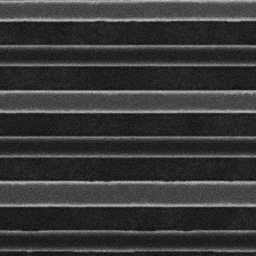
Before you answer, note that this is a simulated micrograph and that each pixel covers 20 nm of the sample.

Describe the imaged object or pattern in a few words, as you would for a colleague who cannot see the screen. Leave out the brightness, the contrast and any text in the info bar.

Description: lines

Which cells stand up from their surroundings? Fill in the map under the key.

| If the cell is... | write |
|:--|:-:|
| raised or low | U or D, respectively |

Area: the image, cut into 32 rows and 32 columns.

UUUUUUUUUUUUUUUUUUUUUUUUUUUUUUUU
UUUUUUUUUUUUUUUUUUUUUUUUUUUUUUUU
UUUUUUUUUUUUUUUUUUUUUUDDDDDDDDDD
DDDDDDDDDDDDDDDDDDDDDDDDDDDDDDDD
DDDDDDDDDDDDDDDDDDDDDDDDDDDDDDDD
DDDDDDDDDDDDDDDDDDDDDDDDDDDDDDDD
UUUUUUUUUUUUUUUUUUUUUUUUUUUUUUUU
UUUUUUUUUUUUUUUUUUUUUUUUUUUUUUUU
DDDDDDDDDDDDDDDDDDDDDDDDDDDDDDDD
DDDDDDDDDDDDDDDDDDDDDDDDDDDDDDDD
DDDDDDDDDDDDDDDDDDDDDDDDDDDDDDDD
UUUUUUUUUUUUUUUUUUUUUUUUUUUUUUUU
UUUUUUUUUUUUUUUUUUUUUUUUUUUUUUUU
UUUUUUUUUUUUUUUUUUUUUUUUUUUUUUUU
DDDDDDDDDDDDDDDDDDDDDDDDDDDDDDDD
DDDDDDDDDDDDDDDDDDDDDDDDDDDDDDDD
DDDDDDDDDDDDDDDDDDDDDDDDDDDDDDDD
UUUUUUUUUUUUUUUUUUUUUUUUUUUUUUUU
UUUUUUUUUUUUUUUUUUUUUUUUUUUUUUUU
UUUUUUUUUUUUUUUUUUUUUUUUUUUUUUUU
DDDDDDDDDDDDDDDDDDDDDDDDDDDDDDDD
DDDDDDDDDDDDDDDDDDDDDDDDDDDDDDDD
DDDDDDDDDDDDDDDDDDDDDDDDDDDDDDDD
UUUUUUUUUUUUUUUUUUUUUUUUUUUUUUUU
UUUUUUUUUUUUUUUUUUUUUUUUUUUUUUUU
UUUUUUUUUUUUUUUUUUUUUUUUUUUUUUUU
DDDDDDDDDDDDDDDDDDDDDDDDDDDDDDDD
DDDDDDDDDDDDDDDDDDDDDDDDDDDDDDDD
DDDDDDDDDDDDDDDDDDDDDDDDDDDDDDDD
UUUUUUUUUUUUUUUUUUUUUUUUUUUUUUUU
UUUUUUUUUUUUUUUUUUUUUUUUUUUUUUUU
DDDDDDDDDDDDDDDDDDDDDDDDDDDDDDDD